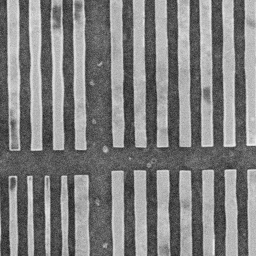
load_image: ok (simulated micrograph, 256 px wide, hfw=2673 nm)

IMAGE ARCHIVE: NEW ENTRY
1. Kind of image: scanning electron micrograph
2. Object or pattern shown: groups of lines, slits or small figures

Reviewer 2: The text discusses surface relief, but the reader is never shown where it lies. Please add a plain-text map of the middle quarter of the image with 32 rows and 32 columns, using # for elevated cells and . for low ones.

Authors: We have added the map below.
...##.......###...##...###...##.
...##.......###...##...###...##.
...##.......###...##...###...##.
...##.......###...##...###...##.
...##.......###...##...###...##.
...##.......###...##...###...##.
...##.......###...##...###...##.
...##.......###...##...###...##.
...##.......###...##...###...##.
...##.......###...##....##...##.
...##.......###...##....##...##.
...##.......###...##....##...##.
...##.......###...##...###...##.
...##.......###...##...###...##.
...##.......###...##...###...##.
...##.......###...##....##...##.
...##.......###...##....##...###
...##.......###...##...###...###
...##.......###...##...###...###
...##........##...##...###...###
...##........##...##...##.......
................................
................................
................................
................................
................................
................................
............###...##...###...##.
#..###......###...##...###...##.
#..###......###...##...###...###
#..###......###...##...###...###
#..###......###...##...###...###